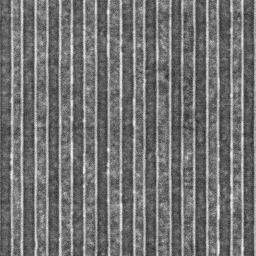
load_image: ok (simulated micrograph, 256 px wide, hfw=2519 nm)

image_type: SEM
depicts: parallel lines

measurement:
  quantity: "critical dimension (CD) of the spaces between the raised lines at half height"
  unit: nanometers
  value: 119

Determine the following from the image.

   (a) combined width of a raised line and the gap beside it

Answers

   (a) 241 nm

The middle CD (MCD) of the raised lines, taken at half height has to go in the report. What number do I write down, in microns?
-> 0.119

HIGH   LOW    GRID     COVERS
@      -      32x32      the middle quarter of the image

@@---@@@---@@@----@@---@@@---@@@
@@---@@@---@@@----@@---@@@---@@@
@@---@@@---@@@----@@---@@@---@@@
@@---@@@---@@@----@@---@@@---@@@
@@---@@@---@@@----@@---@@@---@@@
@@---@@@---@@@----@@---@@@---@@@
@@---@@@---@@@----@@---@@@---@@@
@@---@@@---@@@----@@---@@@---@@@
@@---@@@---@@@----@@---@@@----@@
@@---@@@---@@@----@@---@@@----@@
@@---@@@---@@@----@@---@@@----@@
@@---@@@---@@@----@@---@@@----@@
@@---@@@---@@@----@@---@@@----@@
@@---@@@---@@@----@@---@@@----@@
@@---@@@---@@@----@@---@@@---@@@
@@---@@@---@@@----@@---@@@---@@@
@@---@@@---@@@----@@---@@@---@@@
@@---@@@---@@@----@@---@@@---@@@
@@---@@@---@@@----@@---@@@---@@@
@@---@@@---@@@----@@---@@@----@@
@@---@@@---@@@----@@---@@@----@@
@@---@@@---@@@----@@---@@@----@@
@@---@@@---@@@----@@---@@@----@@
@@---@@@---@@@----@@---@@@---@@@
@@---@@@---@@@----@@---@@@---@@@
@@---@@@---@@@----@@---@@@---@@@
@@---@@@---@@@----@@---@@@---@@@
@@---@@@---@@@----@@---@@@---@@@
@@---@@@---@@@----@@---@@@---@@@
@@---@@@---@@@----@@---@@@---@@@
@@---@@@---@@@----@@---@@@---@@@
@@---@@@---@@@----@@---@@@---@@@